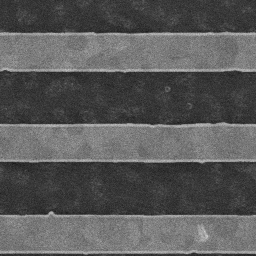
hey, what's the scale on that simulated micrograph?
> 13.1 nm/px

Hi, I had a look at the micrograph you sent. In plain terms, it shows one or a few lines or trenches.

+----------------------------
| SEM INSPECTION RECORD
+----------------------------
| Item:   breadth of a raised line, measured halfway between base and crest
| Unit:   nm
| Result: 474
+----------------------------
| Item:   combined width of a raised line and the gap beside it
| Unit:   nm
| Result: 1190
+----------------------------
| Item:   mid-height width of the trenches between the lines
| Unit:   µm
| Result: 0.724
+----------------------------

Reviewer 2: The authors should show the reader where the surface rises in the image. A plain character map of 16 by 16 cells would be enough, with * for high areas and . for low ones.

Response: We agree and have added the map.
................
................
****************
****************
................
................
................
................
****************
****************
................
................
................
...*............
****************
****************